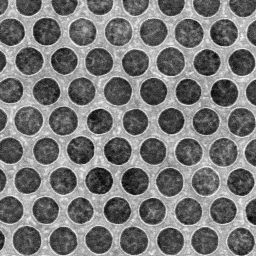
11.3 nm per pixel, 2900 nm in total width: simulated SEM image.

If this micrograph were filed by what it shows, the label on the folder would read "a regular array of holes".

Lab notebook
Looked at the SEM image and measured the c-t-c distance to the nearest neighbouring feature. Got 0.386 um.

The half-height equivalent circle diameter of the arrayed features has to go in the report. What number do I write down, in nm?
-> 319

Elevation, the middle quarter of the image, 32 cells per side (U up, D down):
DDDUUDDDDDDDUUDDDDDDDUUDDDDDDDUU
DDDUUUDDDDDDUUUDDDDDDUUDDDDDDDUU
DUUUUUUDDDDUUUUUDDDDUUUUUDDDDUUU
UUUDDDUUUUUUDDDUUUUUUUDUUUUUUUUU
UUDDDDDUUUUDDDDDUUUUDDDDDUUUUDDD
UDDDDDDDUUDDDDDDDUUDDDDDDDUUDDDD
UDDDDDDDUUDDDDDDDUUDDDDDDDUUDDDD
UDDDDDDDUUDDDDDDDUUDDDDDDDUUDDDD
UDDDDDDUUUDDDDDDDUUDDDDDDUUUDDDD
UUDDDDDUUUUDDDDDUUUUDDDDDUUUUDDD
UUUUDUUUUUUUUDUUUUUUUUUUUUUUUUUU
DDUUUUUDDDDUUUUUUDDUUUUUUDDDDUUU
DDDUUUDDDDDDUUUDDDDDDUUUDDDDDDUU
DDDDUUDDDDDDUUUDDDDDDUUUDDDDDDUU
DDDDUUDDDDDDUUDDDDDDDUUDDDDDDDUU
DDDDUUDDDDDDUUUDDDDDDUUUDDDDDDUU
DDDUUUDDDDDDUUUDDDDDUUUUDDDDDUUU
DDUUUUUUDUUUUUUUDDDUUUUUUUDDUUUU
UUDDDDUUUUUUDDDUUUUUUDDUUUUUUUDD
UDDDDDDUUUUDDDDDUUUUDDDDDUUUUDDD
UDDDDDDDUUDDDDDDDUUDDDDDDUUUDDDD
UDDDDDDDUUDDDDDDDUUDDDDDDDUUDDDD
UDDDDDDDUUDDDDDDDUUDDDDDDDUUDDDD
UDDDDDDUUUDDDDDDDUUDDDDDDUUUDDDD
UUDDDDUUUUUDDDDDUUUUDDDDDUUUUDDD
UUUUUUUUUUUUUUUUUUUUUUUUUUUUUUDD
DDUUUUDDDDDUUUUUDDDDUUUUDDDDDUUU
DDDUUUDDDDDDUUUDDDDDDUUUDDDDDUUU
DDDUUDDDDDDDUUDDDDDDDUUDDDDDDDUU
DDDUUDDDDDDDUUDDDDDDDUUDDDDDDDUU
DDDUUUDDDDDDUUDDDDDDDUUDDDDDDDUU
DDDUUUDDDDDDUUUDDDDDDUUUDDDDDUUU